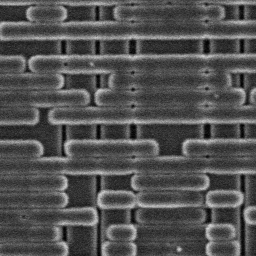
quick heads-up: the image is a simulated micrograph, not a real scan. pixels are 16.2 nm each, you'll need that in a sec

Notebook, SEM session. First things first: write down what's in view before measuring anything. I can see wiring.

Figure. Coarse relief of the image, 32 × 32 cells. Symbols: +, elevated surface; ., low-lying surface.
++++++++++++++++++++++++++++....
...+++++......++++++++++++++....
...+++++......++++++++++++++....
++++++++++++++++++++++++++++++++
++++++++++++++++++++++++++++++++
................................
................................
+++.++++++++++++++++++++++++++++
+++.++++++++++++++++++++++++++++
++++++++......+++++++++++++++...
++++++++......+++++++++++++++...
+++++++++++.++++++++++++++++++..
+++++++++++.++++++++++++++++++++
+++++.++++++++++++++++++++++++++
+++++.++++++++++++++++++++++++++
+++.............................
................................
...........................+++.+
+++++...++++++++++++...+++++++++
+++++...++++++++++++...+++++++++
++++++++++++++++++++++++++++++++
++++++++++++++++++++++++++++++++
++++++++........++++++++++......
++++++++.........+++++++++......
++++++++....++++++++++++..++++..
++++++++....++++++++++++..++++..
++++++++++++...................+
++++++++++++...................+
+++++++.......+++.........+++...
+++++++......++++.........+++...
++++++++.....++++.........++++..
++++++++.....++++.........++++..